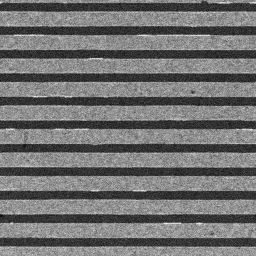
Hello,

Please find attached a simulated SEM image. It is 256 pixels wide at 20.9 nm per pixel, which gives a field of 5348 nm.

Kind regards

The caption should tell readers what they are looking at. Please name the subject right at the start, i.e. parallel lines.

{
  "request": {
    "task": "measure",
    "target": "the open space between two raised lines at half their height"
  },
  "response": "0.206 um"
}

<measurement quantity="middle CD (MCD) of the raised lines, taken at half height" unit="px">13.5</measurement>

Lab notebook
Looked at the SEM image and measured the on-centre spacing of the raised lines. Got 23.5 pixels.